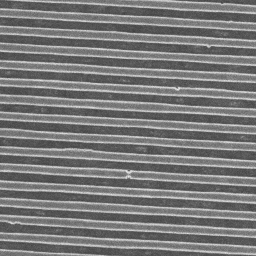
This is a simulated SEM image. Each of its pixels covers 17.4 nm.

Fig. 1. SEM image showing parallel lines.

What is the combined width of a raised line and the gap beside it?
17.2 px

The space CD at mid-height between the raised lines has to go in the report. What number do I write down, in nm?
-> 167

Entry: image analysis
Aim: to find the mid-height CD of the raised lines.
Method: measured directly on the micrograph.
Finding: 135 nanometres